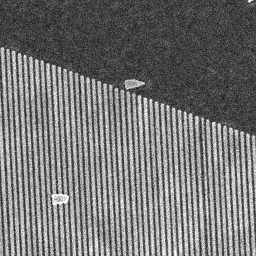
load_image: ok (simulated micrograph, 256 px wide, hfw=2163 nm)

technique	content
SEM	parallel lines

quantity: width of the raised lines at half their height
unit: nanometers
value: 24.3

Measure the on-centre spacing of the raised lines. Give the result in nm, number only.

47.3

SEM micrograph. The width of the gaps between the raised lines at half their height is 24.3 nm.